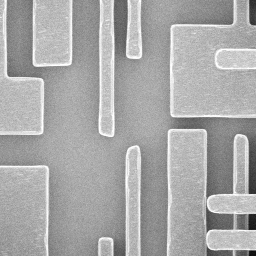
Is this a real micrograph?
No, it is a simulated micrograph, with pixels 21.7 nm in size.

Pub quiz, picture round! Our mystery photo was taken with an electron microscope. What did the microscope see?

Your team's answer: wiring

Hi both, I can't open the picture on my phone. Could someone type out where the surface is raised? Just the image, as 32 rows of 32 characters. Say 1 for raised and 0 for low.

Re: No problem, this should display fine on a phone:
10001111100001001100000000000110
10001111100001001100000000000110
10001111100001001100000000000110
10001111100011001100011111111111
10001111100011001100011111111111
10001111100011001100011111111111
10001111100011001100011111111111
10001111100011000000011111111111
10000000000001000000011111111111
10000000000001000000011111111111
11111000000001000000011111111111
11111000000001000000011111111111
11111000000001000000011111111111
11111000000011000000011111111111
11111000000011000000001111111111
11111000000011000000000000000000
11111000000011000000011111000000
00000000000000000000011111000110
00000000000000001000011111000110
00000000000000001100011111000110
00000000000000001100011111000110
11111100000000001100011111000110
11111100000000001100011111000110
11111100000000001100011111000110
11111100000000001100011111011111
11111100000000001000011111111111
11111100000000001100011111011111
11111100000000001000011111000110
11111100000000001000011111000110
11111100000000001100011111111111
11111100000011001100011111111111
11111100000011001100011111000110